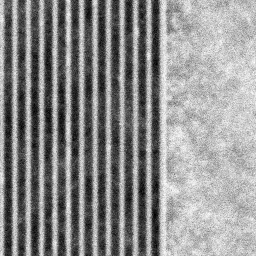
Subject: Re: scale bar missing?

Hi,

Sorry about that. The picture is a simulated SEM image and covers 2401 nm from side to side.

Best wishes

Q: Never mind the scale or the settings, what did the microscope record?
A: parallel lines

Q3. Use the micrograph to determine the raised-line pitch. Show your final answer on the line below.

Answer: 126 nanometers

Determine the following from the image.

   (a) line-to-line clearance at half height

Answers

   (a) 8.25 pixels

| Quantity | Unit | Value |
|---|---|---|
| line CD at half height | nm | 51.6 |